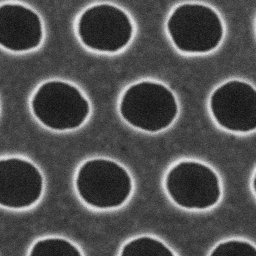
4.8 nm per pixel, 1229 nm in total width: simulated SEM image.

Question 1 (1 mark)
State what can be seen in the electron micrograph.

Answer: holes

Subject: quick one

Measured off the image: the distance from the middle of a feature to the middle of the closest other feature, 0.429 µm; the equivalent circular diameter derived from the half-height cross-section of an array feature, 252 nanometres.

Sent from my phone